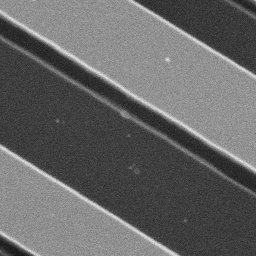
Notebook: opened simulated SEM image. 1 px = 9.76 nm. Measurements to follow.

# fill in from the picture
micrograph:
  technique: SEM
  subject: lines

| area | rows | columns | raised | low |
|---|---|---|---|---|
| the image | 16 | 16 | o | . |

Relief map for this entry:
ooooooooo.......
.oooooooooo.....
...ooooooooo....
....oooooooooo..
......oooooooooo
........oooooooo
.........ooooooo
...........ooooo
............oooo
o.............oo
oo..............
oooo............
oooooo..........
ooooooo.........
ooooooooo.......
.ooooooooo......